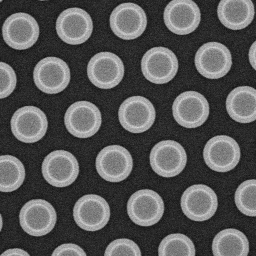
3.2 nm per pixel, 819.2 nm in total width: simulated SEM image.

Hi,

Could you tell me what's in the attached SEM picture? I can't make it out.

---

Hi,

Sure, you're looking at an array of small figures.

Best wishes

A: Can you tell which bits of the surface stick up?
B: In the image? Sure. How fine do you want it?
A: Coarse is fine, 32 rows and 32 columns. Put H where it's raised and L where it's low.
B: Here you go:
LLLLLLLLLLLLLLLHHLLLLHHHLLLHHHHH
LLLLLLLLHHHLLLHHHHLLLHHHHLLHHHHH
LHHHLLLHHHHLLLHHHHLLLHHHHLLHHHHH
HHHHHLLHHHHHLLHHHHLLLHHHLLLLLHLL
HHHHHLLHHHHLLLLHHLLLLLLLLLLLLLLL
LHHHLLLLLHLLLLLLLLLLLLLLLLHHLLLL
LLLLLLLLLLLLLLLLLLHHHLLLLHHHHLLH
LLLLLHHHLLLHHHHLLLHHHHLLHHHHHLLH
HLLLHHHHHLLHHHHLLLHHHHLLLHHHHLLL
HHLLHHHHHLLHHHHLLLHHHHLLLHHHLLLL
HHLLHHHHHLLLHHHLLLLLLLLLLLLLLLLL
HLLLLLHLLLLLLLLLLLLLLLLHLLLLLHHH
LLLLLLLLLLLLLLLLHHLLLLHHHHLLHHHH
LLLHHLLLLHHHLLLHHHHLLLHHHHLLHHHH
LLHHHHLLHHHHHLLHHHHLLLHHHHLLLHHH
LHHHHHLLHHHHHLLHHHHLLLHHHLLLLLLL
LLHHHHLLLHHHLLLLHHLLLLLLLLLLLLLL
LLHHHLLLLLLLLLLLLLLLLLLLLLHHHLLL
LLLLLLLLLLLLLHHLLLLHHHHLLLHHHHLL
HLLLLLHHHLLLHHHHLLLHHHHLLHHHHHLL
HHHLLHHHHHLLHHHHHLLHHHHLLLHHHHLL
HHHLLHHHHHLLHHHHLLLHHHHLLLLLLLLL
HHHLLLHHHLLLLHHLLLLLLLLLLLLLLLLH
HHLLLLLLLLLLLLLLLLLLLLLLHHLLLLHH
LLLLLLLLLLLHLLLLHHHHLLLHHHHLLHHH
LLLHHHLLLHHHHLLLHHHHLLLHHHHLLHHH
LLLHHHHLLHHHHHLLHHHHLLLHHHHLLLHH
LLHHHHHLLHHHHHLLLHHHLLLLHHLLLLLL
LLLHHHHLLLHHHLLLLLLLLLLLLLLLLLLL
LLLLLLLLLLLLLLLLLLLLLHHLLLLHHHHL
LLLLLLLLHLLLLLHHHLLLHHHHLLLHHHHL
LHHLLLLHHHHLLHHHHHLLHHHHLLLHHHHL